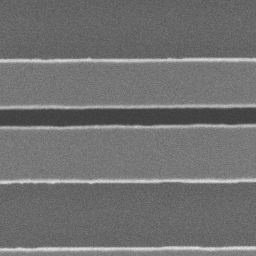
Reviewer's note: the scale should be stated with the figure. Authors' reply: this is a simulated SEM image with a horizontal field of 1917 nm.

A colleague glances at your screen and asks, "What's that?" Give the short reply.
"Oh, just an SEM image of lines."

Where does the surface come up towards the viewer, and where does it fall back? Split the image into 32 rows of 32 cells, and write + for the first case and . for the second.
................................
................................
................................
................................
................................
................................
................................
.......+++++++++++++++++++++++++
++++++++++++++++++++++++++++++++
++++++++++++++++++++++++++++++++
++++++++++++++++++++++++++++++++
++++++++++++++++++++++++++++++++
++++++++++++++++++++++++++++++++
++++++++++++++++++++++++...++...
................................
................................
++++++++++++++++++++++++++++++++
++++++++++++++++++++++++++++++++
++++++++++++++++++++++++++++++++
++++++++++++++++++++++++++++++++
++++++++++++++++++++++++++++++++
++++++++++++++++++++++++++++++++
++++++++++++++++++++++++++++++++
................................
................................
................................
................................
................................
................................
................................
................................
++++++++++++++++++++++++++++++++